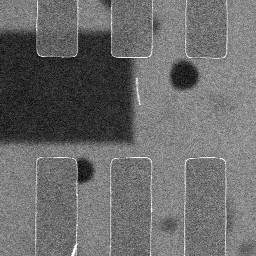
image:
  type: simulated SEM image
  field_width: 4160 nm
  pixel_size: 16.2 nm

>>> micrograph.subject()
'groups of lines, slits or small figures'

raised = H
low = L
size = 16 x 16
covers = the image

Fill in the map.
LLHHHLLHHHLLHHLL
LLHHHLLHHHLLHHLL
LLHHHLLHHHLLHHLL
LLLHLLLHHLLLHHLL
LLLLLLLLLLLLLLLL
LLLLLLLLLLLLLLLL
LLLLLLLLLLLLLLLL
LLLLLLLLLLLLLLLL
LLLLLLLLLLLLLLLL
LLLLLLLLLLLLLLLL
LLHHHLLHHLLLHHLL
LLHHHLLHHLLLHHLL
LLHHHLLHHLLLHHLL
LLHHHLLHHLLLHHLL
LLHHHLLHHLLLHHLL
LLHHHLLHHLLLHHLL